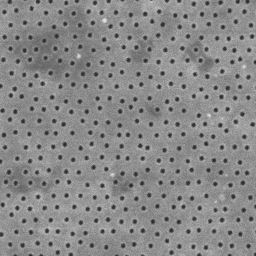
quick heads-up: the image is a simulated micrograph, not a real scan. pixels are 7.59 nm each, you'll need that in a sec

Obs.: a regular array of holes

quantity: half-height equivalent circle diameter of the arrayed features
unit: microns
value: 0.0353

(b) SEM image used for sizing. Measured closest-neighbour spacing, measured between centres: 11.6 px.